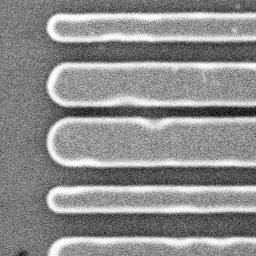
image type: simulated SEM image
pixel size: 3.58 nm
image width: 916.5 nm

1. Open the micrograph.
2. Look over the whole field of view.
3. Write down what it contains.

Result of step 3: groups of lines, slits or small figures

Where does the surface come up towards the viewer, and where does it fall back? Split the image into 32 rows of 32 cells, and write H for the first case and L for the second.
LLLLLLLLLLLLLLLLLLLLLLLLLLLLLLLL
LLLLLLLLLLLLLLLLLLLLLLLLLLLLLLLL
LLLLLLHHHHHHHHHHHHHHHHHHHHHHHHHH
LLLLLLHHHHHHHHHHHHHHHHHHHHHHHHHH
LLLLLLLHHHHHHHHHHHHHHHHHHHHHHHHH
LLLLLLLLLLLLLLLLLLLLLLLLLLLLLLLL
LLLLLLLLLLLLLLLLLLLLLLLLLLLLLLLL
LLLLLLLLLLLLLLLLLLLLLLLLLLLLLLLL
LLLLLLLHHHHHHHHHHHHHHHHHHHHHHHHH
LLLLLLLHHHHHHHHHHHHHHHHHHHHHHHHH
LLLLLLHHHHHHHHHHHHHHHHHHHHHHHHHH
LLLLLLHHHHHHHHHHHHHHHHHHHHHHHHHH
LLLLLLLHHHHHHHHHHHHHHHHHHHHHHHHH
LLLLLLLLLLLLLLLLLLLLLLLLLLLLLLLL
LLLLLLLLLLLLLLLLLLLLLLLLLLLLLLLL
LLLLLLLHHHHHHHHHHHHHHHHHHHHHHHHH
LLLLLLHHHHHHHHHHHHHHHHHHHHHHHHHH
LLLLLLHHHHHHHHHHHHHHHHHHHHHHHHHH
LLLLLLHHHHHHHHHHHHHHHHHHHHHHHHHH
LLLLLLLHHHHHHHHHHHHHHHHHHHHHHHHH
LLLLLLLLHHHHHHHHHHHHHHHHHHHHHHHH
LLLLLLLLLLLLLLLLLLLLLLLLLLLLLLLL
LLLLLLLLLLLLLLLLLLLLLLLLLLLLLLLL
LLLLLLLLLLHHHHHHHHHHHHHHHHHHHHHH
LLLLLLHHHHHHHHHHHHHHHHHHHHHHHHHH
LLLLLLHHHHHHHHHHHHHHHHHHHHHHHHHH
LLLLLLLLLLLLLLLLLLLLLLLLLLLLLLLL
LLLLLLLLLLLLLLLLLLLLLLLLLLLLLLLL
LLLLLLLLLLLLLLLLLLLLLLLLLLLLLLLL
LLLLLLLLLLLLLLLLLLLLLLLLLLLLLLLL
LLLLLLLHHHHHHHHHHHHHHHHHHHHHHHHH
LLLLLLLHHHHHHHHHHHHHHHHHHHHHHHHH